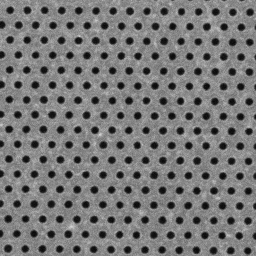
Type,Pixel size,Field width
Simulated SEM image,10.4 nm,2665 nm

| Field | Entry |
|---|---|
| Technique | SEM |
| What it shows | a regular array of holes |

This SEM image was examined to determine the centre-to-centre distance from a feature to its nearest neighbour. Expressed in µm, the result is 0.176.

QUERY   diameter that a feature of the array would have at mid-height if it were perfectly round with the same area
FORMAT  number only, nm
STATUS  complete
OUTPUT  87.1